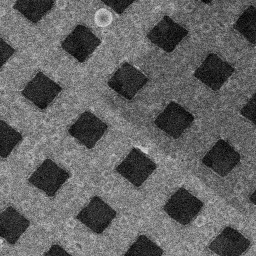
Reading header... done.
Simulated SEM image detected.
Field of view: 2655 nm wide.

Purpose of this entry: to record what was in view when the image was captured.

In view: a regular array of raised bodies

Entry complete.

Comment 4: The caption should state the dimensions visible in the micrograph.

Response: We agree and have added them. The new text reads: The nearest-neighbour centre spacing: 628 nm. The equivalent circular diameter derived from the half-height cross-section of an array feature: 365 nanometres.